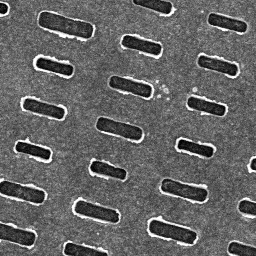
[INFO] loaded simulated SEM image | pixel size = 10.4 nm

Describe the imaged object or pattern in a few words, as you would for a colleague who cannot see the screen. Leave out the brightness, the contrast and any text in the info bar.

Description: a regular array of holes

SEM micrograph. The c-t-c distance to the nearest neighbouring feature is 448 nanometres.